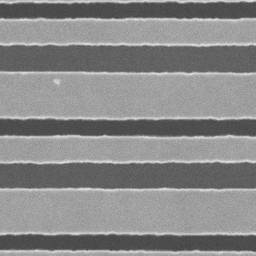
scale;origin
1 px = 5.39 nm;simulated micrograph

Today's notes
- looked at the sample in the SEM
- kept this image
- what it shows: lines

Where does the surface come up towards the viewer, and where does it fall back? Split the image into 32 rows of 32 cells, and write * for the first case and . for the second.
................................
................................
********************************
********************************
********************************
**.******.**********************
................................
................................
................................
********************************
********************************
********************************
********************************
********************************
********************************
................................
................................
********************************
********************************
********************************
................................
................................
................................
................................
********************************
********************************
********************************
********************************
********************************
................................
................................
********************************